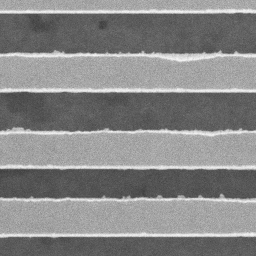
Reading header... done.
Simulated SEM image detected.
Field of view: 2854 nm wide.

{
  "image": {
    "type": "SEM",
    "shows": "lines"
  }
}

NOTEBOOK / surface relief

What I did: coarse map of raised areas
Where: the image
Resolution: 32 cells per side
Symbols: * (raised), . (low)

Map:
********************************
********************************
................................
................................
................................
................................
................................
********************************
********************************
********************************
********************************
................................
................................
................................
................................
................................
.***.......************......***
********************************
********************************
********************************
********************************
................................
................................
................................
................................
********************************
********************************
********************************
********************************
********************************
................................
................................